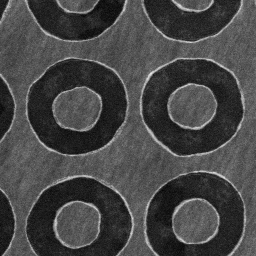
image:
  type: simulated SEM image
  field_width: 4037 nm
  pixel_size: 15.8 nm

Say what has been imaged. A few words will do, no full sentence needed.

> ring-shaped grooves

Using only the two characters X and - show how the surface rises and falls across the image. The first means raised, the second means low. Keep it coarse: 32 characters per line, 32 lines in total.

-XX----XXXXX----XX----XXXX----XX
-XXX-----XX----XXX------------XX
XXXXX----------XXXX----------XXX
XXXXX---------XXXXXX--------XXXX
XXXXXXX-----XXXXXXXXX------XXXXX
XXXXXXXXXXXXXXXXXXXXXXXXXXXXXXXX
XXXXXXXXXXXXXXXXXXXXXXXXXXXXXXXX
XXXXXXXX---XXXXXXXXXXX----XXXXXX
XXXXXX--------XXXXXX--------XXXX
XXXXX----------XXXX----------XXX
-XXX-----------XXX-----X------XX
-XXX----XXXX----XX----XXXX----XX
--X----XXXXXX---XX---XXXXXX---XX
--X----XXXXXX---XX---XXXXXX---XX
--X----XXXXX----XX---XXXXXX---XX
-XXX---XXXXX---XXX----XXXX----XX
-XXX-----------XXXX-----------XX
XXXXX---------XXXXXX---------XXX
XXXXXX-------XXXXXXXX------XXXXX
XXXXXXXXXXXXXXXXXXXXXXXXXXXXXXXX
XXXXXXXXXXXXXXXXXXXXXXXXXXXXXXXX
XXXXXXXXXXXXXXXXXXXXXXXX-XXXXXXX
XXXXXXXX----XXXXXXXXX-------XXXX
XXXXXX--------XXXXXX---------XXX
-XXXX----------XXXX-----------XX
-XXX----XXX-----XXX----XXX----XX
--XX---XXXXX----XX----XXXXX----X
--X----XXXXX-----X----XXXXX----X
--X----XXXXX-----X----XXXXX----X
--X----XXXXX----XX----XXXXX---XX
-XXX----XXX-----XXX-----------XX
-XXX-----------XXXX----------XXX